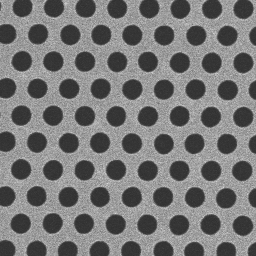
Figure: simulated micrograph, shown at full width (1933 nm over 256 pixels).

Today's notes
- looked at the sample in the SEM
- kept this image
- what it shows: a regular array of holes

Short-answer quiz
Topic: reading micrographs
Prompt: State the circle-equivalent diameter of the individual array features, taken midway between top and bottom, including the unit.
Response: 147 nm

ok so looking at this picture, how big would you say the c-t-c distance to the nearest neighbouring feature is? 234 nm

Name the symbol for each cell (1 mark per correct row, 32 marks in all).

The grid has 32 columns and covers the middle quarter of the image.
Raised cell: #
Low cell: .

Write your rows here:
###....####....####....####....#
####...#####...#####..#####...##
################################
################################
...####....#####...#####..#####.
....###.....###....####....####.
....###.....###.....##.....###..
...####....####....####....####.
#.######..######..######..######
################################
################################
###....####....####....####....#
###.....###....####....####....#
###.....###....###......##.....#
###....####....####....####....#
####################..######.###
################################
..######..######.###############
...####....####....####....####.
....##......###....####....###..
....###....####....####....###..
...####....####....####....####.
################################
################################
####...####...######..######..##
###....####....####....####....#
###....####....####....####....#
###....####....####....####....#
####...#####..#####....####...##
################################
################################
...####....####....####...#####.